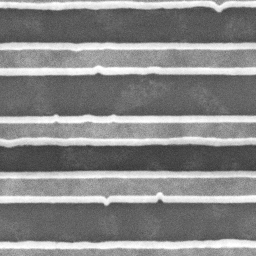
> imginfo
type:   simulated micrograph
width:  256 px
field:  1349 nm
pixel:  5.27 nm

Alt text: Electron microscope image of one or a few lines or trenches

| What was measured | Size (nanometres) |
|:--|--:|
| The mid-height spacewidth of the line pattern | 226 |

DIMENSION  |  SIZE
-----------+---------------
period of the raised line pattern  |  337 nanometres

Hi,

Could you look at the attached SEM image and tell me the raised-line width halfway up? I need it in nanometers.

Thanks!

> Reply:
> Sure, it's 130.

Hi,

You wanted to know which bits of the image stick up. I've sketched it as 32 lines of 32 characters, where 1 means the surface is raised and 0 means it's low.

11111111111111111111111110111000
00000000000000000000000000000000
00000000000000000000000000000000
00000000000000000000000000000000
00000000000000000000000000000000
00000000000000000000000000000000
11111111111111111111111111111111
11111111111111111111111111111111
11111111111111111111111111111111
00000000000000000000000000000000
00000000000000000000000000000000
00000000000000000000000000000000
00000000000000000000000000000000
00000000000000000000000000000000
00000000000000000000000000000000
11111111111111111111111111111111
11111111111111111111111111111111
11111111111111111111111111111111
00000000000000000000000000000000
00000000000000000000000000000000
00000000000000000000000000000000
00000000000000000000000000000000
11111111111111111111111111111111
11111111111111111111111111111111
11111111111111111111111111111111
00000000000000000000000000000000
00000000000000000000000000000000
00000000000000000000000000000000
00000000000000000000000000000000
00000000000000000000000000000000
00000000000000000000000011111111
11111111111111111111111111111111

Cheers